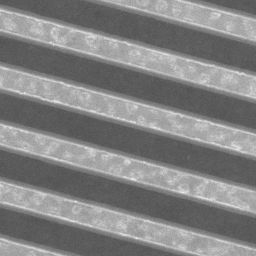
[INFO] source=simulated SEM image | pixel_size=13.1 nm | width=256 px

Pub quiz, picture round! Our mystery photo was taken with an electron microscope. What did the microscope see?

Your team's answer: parallel lines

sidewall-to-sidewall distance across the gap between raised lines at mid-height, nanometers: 419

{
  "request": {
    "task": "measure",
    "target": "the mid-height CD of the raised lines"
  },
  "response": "308 nm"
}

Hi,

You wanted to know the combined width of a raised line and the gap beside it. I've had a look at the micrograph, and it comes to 725 nm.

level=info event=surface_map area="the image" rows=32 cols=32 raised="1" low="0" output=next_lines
00000000000000111111111110000000
11000000000000000011111111111000
11111100000000000000001111111111
11111111110000000000000001111111
00111111111110000000000000000111
00000011111111111000000000000000
00000000001111111111100000000000
00000000000001111111111110000000
10000000000000000111111111110000
11111000000000000000011111111111
11111111100000000000000011111111
01111111111110000000000000001111
00000111111111110000000000000000
00000000011111111111000000000000
00000000000001111111111100000000
10000000000000001111111111110000
11110000000000000000111111111110
11111111000000000000000011111111
01111111111100000000000000001111
00001111111111110000000000000001
00000000111111111110000000000000
00000000000011111111111000000000
00000000000000001111111111100000
11110000000000000001111111111110
11111111000000000000000111111111
11111111111100000000000000011111
00001111111111100000000000000001
00000001111111111110000000000000
00000000000111111111111000000000
00000000000000011111111111100000
11100000000000000001111111111100
11111110000000000000001111111111